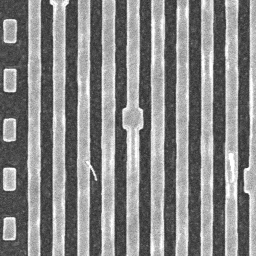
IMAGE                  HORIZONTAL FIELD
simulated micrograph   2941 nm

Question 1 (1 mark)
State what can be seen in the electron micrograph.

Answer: wiring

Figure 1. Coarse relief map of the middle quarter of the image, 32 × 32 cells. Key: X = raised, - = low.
----XX----XXX---XXX---XXX---XXX-
----XX----XXX---XXX---XXX---XXX-
----XX----XXX---XXX---XXX---XXX-
----XX----XX----XXX---XXX---XXX-
----XX----XX----XXX---XXX---XXX-
----XX----XX----XXX---XXX---XXX-
----XX----XX----XXX---XXX---XXX-
----XX----XX----XXX---XXX---XXX-
----XX----XXX---XXX---XXX---XXX-
----XX----XXX---XXX---XXX---XXX-
----XX----XXX---XXX---XXX---XXX-
----XX----XXX--XXXX---XXX---XXX-
----XX----XX---XXXX---XXX---XXX-
----XX----XX---XXXXX--XXX---XXX-
----XX----XX---XXXXX--XXX---XXX-
----XX----XX---XXXXX--XXX---XXX-
----XX----XX----XXX---XXX---XXX-
----XX----XX----XXX---XXX---XXX-
----XX---XXX----XXX---XXX---XXX-
----XX---XXX----XXX---XXX---XXX-
----XX---XXX----XXX---XXX---XXX-
----XX---XXX----XXX---XXX---XXX-
----XX----XX----XXX---XXX---XXX-
---XXX----XX----XXX---XXX---XXX-
---XXX----XX----XXX---XXX---XXX-
---XXXX---XX----XXX---XXX---XXX-
---XXXX---XX----XXX---XXX---XXX-
---XXX----XX----XXX---XXX---XXX-
---XXX----XX----XXX---XXX---XXX-
----XX----XX----XXX---XXX---XXX-
----XX----XX----XXX---XXX---XXX-
----XX----XX----XXX---XXX---XXX-